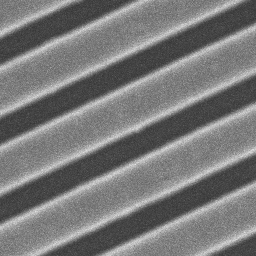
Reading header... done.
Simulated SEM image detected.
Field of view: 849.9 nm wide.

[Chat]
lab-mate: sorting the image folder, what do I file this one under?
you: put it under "one or a few lines or trenches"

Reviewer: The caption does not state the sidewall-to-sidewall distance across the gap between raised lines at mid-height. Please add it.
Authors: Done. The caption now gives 91.2 nm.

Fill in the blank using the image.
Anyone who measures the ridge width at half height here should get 148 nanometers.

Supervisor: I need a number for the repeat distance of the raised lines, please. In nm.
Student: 238